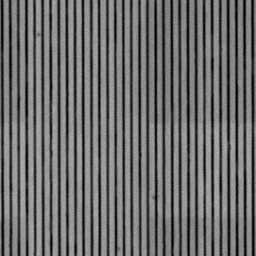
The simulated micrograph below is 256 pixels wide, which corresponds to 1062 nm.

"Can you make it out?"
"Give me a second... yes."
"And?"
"parallel lines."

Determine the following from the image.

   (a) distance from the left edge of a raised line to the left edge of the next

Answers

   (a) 33.5 nanometres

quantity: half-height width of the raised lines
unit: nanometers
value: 24.9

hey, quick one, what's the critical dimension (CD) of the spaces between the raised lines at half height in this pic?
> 10.4 nanometres